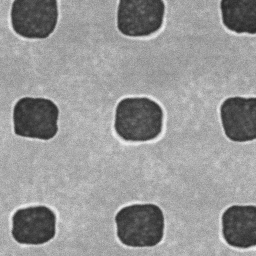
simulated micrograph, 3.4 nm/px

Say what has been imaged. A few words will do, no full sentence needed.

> holes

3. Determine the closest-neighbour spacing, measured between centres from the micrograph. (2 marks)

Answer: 354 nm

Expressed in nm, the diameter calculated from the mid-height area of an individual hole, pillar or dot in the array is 161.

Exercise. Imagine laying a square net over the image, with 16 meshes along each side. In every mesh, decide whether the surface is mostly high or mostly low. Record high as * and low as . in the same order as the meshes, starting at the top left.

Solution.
*...***...****..
*...***...****..
****************
****************
****************
****************
*..****...****..
*...***...****..
*..****...****..
****************
****************
****************
****************
*..****...****..
*..****...****..
***************.